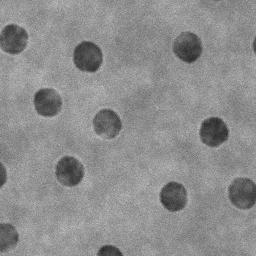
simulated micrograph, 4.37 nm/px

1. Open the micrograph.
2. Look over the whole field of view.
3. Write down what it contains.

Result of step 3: holes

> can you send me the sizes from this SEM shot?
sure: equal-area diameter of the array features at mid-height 136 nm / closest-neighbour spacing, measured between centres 265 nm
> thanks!